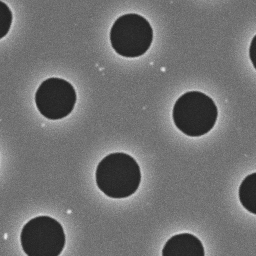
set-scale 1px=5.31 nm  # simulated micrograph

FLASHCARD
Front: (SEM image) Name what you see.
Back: holes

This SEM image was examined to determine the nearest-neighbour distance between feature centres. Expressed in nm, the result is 523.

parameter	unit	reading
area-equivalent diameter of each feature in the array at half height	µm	0.238